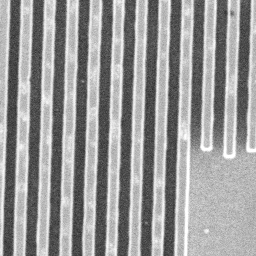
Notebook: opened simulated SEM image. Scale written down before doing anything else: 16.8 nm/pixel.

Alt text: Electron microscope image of parallel lines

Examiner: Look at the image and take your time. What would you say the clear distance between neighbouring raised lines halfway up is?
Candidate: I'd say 12.2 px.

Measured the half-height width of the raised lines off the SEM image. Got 174 nm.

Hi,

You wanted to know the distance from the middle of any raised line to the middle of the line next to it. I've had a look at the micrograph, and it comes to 385 nanometers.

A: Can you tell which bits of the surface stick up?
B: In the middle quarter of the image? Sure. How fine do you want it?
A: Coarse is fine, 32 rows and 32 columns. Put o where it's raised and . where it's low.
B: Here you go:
ooo...ooo...oo....oo...ooo...ooo
ooo...ooo...ooo...oo...ooo...ooo
ooo...ooo...ooo...oo...ooo...ooo
ooo...ooo...oo....oo...ooo...ooo
.oo...ooo...oo....oo...ooo...ooo
.oo...ooo...oo....oo...ooo...ooo
ooo...oo....oo...ooo...ooo...ooo
ooo...oo....oo...ooo...ooo...ooo
ooo...oo....oo...ooo...ooo...ooo
ooo...oo....oo....oo...ooo...oo.
ooo...oo....oo...ooo...ooo...oo.
ooo...oo....oo...ooo...ooo...oo.
ooo...oo....oo...ooo...ooo...oo.
ooo...oo....oo...ooo...oo....oo.
ooo...oo....oo...ooo...oo....oo.
ooo...oo....oo...ooo...oo....oo.
ooo...oo....oo...ooo...oo....oo.
ooo...oo...ooo...ooo...oo....oo.
oo....oo...ooo...ooo...ooo...oo.
oo....oo...ooo...ooo...ooo...oo.
oo....oo...ooo...ooo...oo....oo.
oo....oo...ooo...ooo...oo....oo.
oo....oo...ooo...ooo...oo...ooo.
oo....oo...ooo...ooo...oo...ooo.
oo....oo...ooo...oo....oo...ooo.
oo....oo...ooo...oo....oo...ooo.
oo....oo...ooo...oo....oo...ooo.
oo....oo...ooo...oo....oo...ooo.
oo...ooo...oo....oo....oo...ooo.
oo...ooo...oo....oo....oo...ooo.
oo...ooo...oo....oo....oo...ooo.
oo...ooo...oo....oo....oo...ooo.